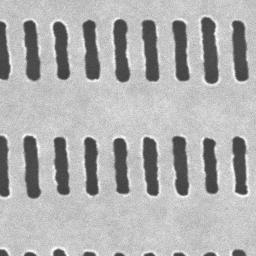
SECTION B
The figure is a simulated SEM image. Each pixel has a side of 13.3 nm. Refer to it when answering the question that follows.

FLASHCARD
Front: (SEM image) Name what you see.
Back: a regular array of holes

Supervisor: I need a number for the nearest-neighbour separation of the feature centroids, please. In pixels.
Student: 29.7